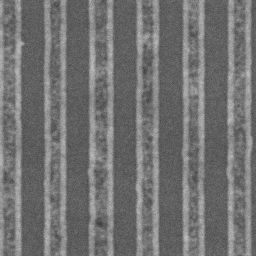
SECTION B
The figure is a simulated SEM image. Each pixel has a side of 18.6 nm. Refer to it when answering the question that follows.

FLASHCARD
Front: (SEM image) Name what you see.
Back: parallel lines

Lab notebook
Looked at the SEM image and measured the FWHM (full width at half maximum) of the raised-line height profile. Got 325 nm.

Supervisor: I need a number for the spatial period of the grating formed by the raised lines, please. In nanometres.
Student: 856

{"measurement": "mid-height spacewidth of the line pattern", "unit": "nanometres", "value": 538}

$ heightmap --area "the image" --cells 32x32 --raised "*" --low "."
**....**...***...***...**....**.
**....**...***...***...**....**.
**....**...***...***...**....**.
**....**...***...***...**....**.
**....**...***...***...**....**.
**....**...***...***...**....**.
**....**...***...**....**....**.
**....**....**...***...**....**.
**....**...***...**....**....**.
**....**...***...**....**....**.
**....**...***....*....**....**.
**....**...***...**....**....**.
**....**...***...**....**....**.
**....**...***...**....**....**.
**....**...***...**....**....**.
**....**...***...**....**....**.
**....**....**...**....**....**.
**....**...***...**....**....**.
**....**...***...**....**....**.
**....**...***...**....**....**.
**....**...***....*....**....**.
**....**...***...**....**....**.
**....**...***...**....**....**.
**....**...***...**....**....**.
**....**....**...**....**....**.
**....**....**...**....**....**.
**....**....**...**....**....**.
**....**...***...**....**....**.
**....**...***...**....**....**.
**....**...***...**....**....**.
**....**...***...**....**....**.
**....**...***...***...**....**.